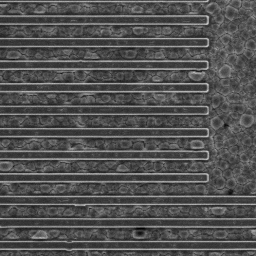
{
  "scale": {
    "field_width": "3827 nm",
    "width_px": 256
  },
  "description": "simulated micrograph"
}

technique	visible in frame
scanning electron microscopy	parallel lines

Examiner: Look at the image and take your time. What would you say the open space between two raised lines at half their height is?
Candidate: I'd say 212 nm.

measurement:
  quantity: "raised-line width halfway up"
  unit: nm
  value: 127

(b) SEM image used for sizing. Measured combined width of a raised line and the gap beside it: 336 nm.